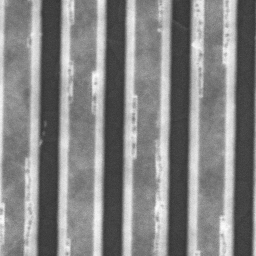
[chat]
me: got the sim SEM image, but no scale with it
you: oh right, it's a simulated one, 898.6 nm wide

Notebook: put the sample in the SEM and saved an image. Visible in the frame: one or a few lines or trenches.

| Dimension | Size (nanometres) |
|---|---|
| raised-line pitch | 229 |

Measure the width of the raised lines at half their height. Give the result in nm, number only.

124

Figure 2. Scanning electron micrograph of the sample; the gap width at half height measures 106 nm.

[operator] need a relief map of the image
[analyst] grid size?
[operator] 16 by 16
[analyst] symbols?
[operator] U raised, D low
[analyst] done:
UUDDUUDDUUDDUUDD
UUDDUUDDUUDDUUDD
UUDDUUDDUUDDUUDD
UUDDUUDDUUDDUUDD
UUDDUUDDUUDDUUDD
UUDDUUDDUUDDUUDD
UUDDUUDDUUDDUUDD
UUDDUUDDUUDDUUDD
UUDDUUDDUUDDUUDD
UUDDUUDDUUDDUUDD
UUDDUUDDUUDDUUDD
UUDDUUDDUUDDUUDD
UUDDUUDDUUDDUUDD
UUDDUUDDUUDDUUDD
UUDDUUDDUUDDUUDD
UUDDUUDDUUDDUUDD